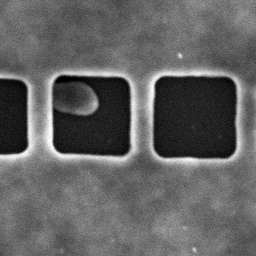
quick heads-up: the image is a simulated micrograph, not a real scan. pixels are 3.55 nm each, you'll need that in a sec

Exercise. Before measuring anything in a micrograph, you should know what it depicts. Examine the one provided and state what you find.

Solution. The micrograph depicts holes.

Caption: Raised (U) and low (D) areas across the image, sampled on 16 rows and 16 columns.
UUUUUUUUUUUUUUUU
UUUUUUUUUUUUUUUU
UUUUUUUUUUUUUUUU
UUUUUUUUUUUUUUUU
UUUUUUUUUUUUUUUU
DDUDDDDDUUDDDDDU
DDUDDDDDUUDDDDDU
DDUDDDDDUUDDDDDU
DDUDDDDDUUDDDDDU
DUUUDDDDUUDDDDDU
UUUUUUUUUUUUUUUU
UUUUUUUUUUUUUUUU
UUUUUUUUUUUUUUUU
UUUUUUUUUUUUUUUU
UUUUUUUUUUUUUUUU
UUUUUUUUUUUUUUUU